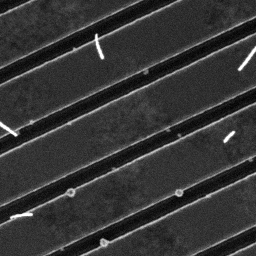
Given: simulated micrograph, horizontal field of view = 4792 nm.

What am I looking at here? lines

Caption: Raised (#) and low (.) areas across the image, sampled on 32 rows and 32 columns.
...##############....###########
.##############....#############
#############....##############.
###########....##############...
########.....##############....#
######.....##############....###
####.....##############....#####
##.....##############....#######
....###############....#########
..##############.....###########
##############.....#############
############.....##############.
##########....###############...
########....##############.....#
######....##############....####
####....##############....######
##....##############....########
....##############....##########
..##############....############
##############....##############
###########.....##############..
#########.....##############....
#######.....##############....##
#####.....##############....####
###.....##############....######
#....##############.....########
...##############.....##########
.##############.....############
#############....##############.
###########....##############...
#########...###############.....
#######....##############.....##